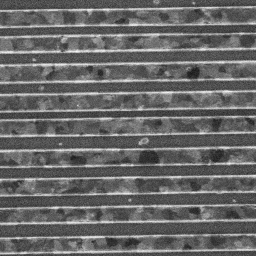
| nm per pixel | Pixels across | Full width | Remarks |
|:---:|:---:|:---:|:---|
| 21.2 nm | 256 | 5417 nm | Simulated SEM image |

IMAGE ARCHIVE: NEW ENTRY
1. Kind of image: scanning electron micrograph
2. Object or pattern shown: parallel lines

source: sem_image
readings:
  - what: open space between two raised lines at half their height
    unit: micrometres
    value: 0.28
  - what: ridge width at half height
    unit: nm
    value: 341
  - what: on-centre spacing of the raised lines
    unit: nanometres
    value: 600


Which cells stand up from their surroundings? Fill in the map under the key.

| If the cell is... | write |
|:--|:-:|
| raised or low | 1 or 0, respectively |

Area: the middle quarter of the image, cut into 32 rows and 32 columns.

11111111111111111111111111111111
11111111111111111111111111111111
11111111111111111111111111111111
11111111111111111111111111111111
00000000000000000000000000000000
00000000000000000000000000000000
00000000000000000000000000000000
00000001111111111111111111111111
11111111111111111111111111111111
11111111111111111111111111111111
11111111111111111111111111111111
11111100000000000000000000000000
00000000000000000000000000000000
00000000000000000000000000000000
11111111111111111111111111111111
11111111111111111111111111111111
11111111111111111111111111111111
11111111111111111110000000000000
00000000000000000000000000000000
00000000000000000000000000000000
00000000000000000000000000000000
00000000000000000000001111111111
11111111111111111111111111111111
11111111111111111111111111111111
11111111111111111111111111111111
00000000000000000000000000000000
00000000000000000000000000000000
00000000000000000000000000000000
00000000000000011111111111111111
11111111111111111111111111111111
11111111111111111111111111111111
11111111111111111111111111111111